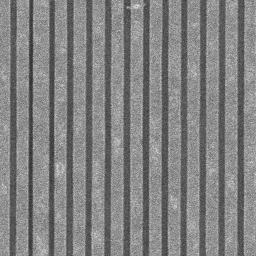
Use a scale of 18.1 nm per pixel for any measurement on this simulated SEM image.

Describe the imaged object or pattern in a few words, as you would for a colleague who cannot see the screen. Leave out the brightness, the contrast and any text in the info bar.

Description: parallel lines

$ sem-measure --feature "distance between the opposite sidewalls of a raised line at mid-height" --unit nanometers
222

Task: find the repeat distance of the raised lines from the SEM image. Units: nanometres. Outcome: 344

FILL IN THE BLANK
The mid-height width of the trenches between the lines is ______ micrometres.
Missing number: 0.12